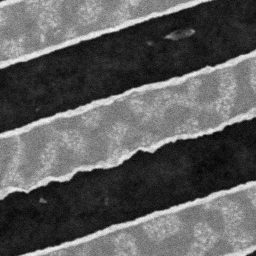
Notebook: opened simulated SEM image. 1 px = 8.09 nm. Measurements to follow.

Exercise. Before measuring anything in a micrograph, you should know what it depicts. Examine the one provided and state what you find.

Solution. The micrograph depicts one or a few lines or trenches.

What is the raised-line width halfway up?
479 nanometres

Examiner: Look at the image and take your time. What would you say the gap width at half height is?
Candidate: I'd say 527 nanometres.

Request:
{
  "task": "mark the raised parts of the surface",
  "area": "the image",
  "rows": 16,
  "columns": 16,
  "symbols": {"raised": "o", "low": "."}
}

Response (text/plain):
ooooooooooo.....
oooooooo........
ooooo...........
oo.............o
............oooo
.........ooooooo
......oooooooooo
...oooooooooooo.
oooooooooooo....
oooooooo........
oooooo..........
ooo.............
.............ooo
.........ooooooo
......oooooooooo
...ooooooooooooo